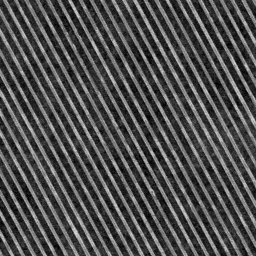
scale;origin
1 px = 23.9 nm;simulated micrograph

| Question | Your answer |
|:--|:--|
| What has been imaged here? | parallel lines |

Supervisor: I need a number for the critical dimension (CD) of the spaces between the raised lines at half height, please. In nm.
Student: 166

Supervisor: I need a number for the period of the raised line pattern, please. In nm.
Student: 228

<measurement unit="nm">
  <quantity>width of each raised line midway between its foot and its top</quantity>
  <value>60.5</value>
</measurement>